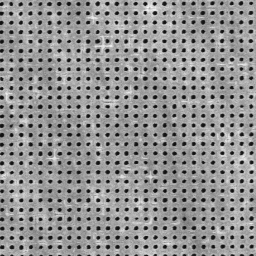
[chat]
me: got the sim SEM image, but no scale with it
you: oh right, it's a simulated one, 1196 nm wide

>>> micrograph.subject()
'a regular array of holes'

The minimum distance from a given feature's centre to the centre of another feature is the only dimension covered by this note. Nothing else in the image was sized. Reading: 0.042 micrometres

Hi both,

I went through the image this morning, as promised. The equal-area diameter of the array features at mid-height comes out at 19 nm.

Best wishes